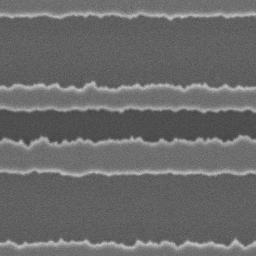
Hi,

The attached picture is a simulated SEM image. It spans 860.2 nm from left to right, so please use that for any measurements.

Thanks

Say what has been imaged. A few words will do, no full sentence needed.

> lines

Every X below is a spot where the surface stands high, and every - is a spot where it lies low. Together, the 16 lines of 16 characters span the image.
XXXXXXXXXXXXXXXX
----------------
----------------
----------------
----------------
XXXXXXXXXXXXXXXX
XXXXXXXXXXXXXXXX
----------------
----------------
XXXXXXXXXXXXXXXX
XXXXXXXXXXXXXXXX
----------------
----------------
----------------
----------------
XXXXXXXXXXXXXXXX